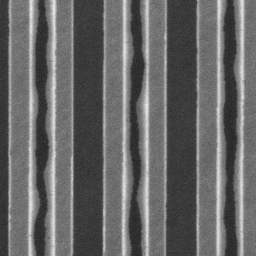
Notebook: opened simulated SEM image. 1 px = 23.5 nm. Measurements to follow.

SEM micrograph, lines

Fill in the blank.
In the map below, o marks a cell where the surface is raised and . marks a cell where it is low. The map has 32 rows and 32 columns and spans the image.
.ooo..ooo....ooo..ooo....ooo..oo
.ooo..ooo....ooo..ooo....ooo..oo
.ooo..ooo....ooo..ooo....ooo..oo
.ooo...oo....ooo..ooo....oo...oo
.ooo...oo....ooo..ooo....oo...oo
.ooo..ooo....ooo..ooo....ooo..oo
.ooo..ooo....ooo..ooo....oo...oo
.ooo..ooo....ooo..ooo....oo...oo
.ooo..ooo....ooo..ooo....oo...oo
.ooo..ooo....ooo..ooo....oo...oo
.ooo..ooo....ooo..ooo....ooo..oo
.ooo..ooo....ooo..ooo....ooo..oo
.ooo..ooo....ooo..ooo....ooo..oo
.ooo..ooo....ooo..ooo....oo...oo
.ooo..ooo....ooo..ooo....oo...oo
.ooo..ooo....ooo..ooo....oo...oo
.ooo..ooo....ooo..ooo....oo...oo
.ooo..ooo....ooo..ooo....ooo..oo
.ooo...oo....ooo..ooo....ooo..oo
.ooo..ooo....ooo..ooo....ooo..oo
.ooo..ooo....ooo..ooo....ooo..oo
.ooo..ooo....ooo..ooo....ooo..oo
.ooo..ooo....ooo..ooo....ooo..oo
.ooo..ooo....ooo..ooo....ooo..oo
.ooo..ooo....ooo..ooo....ooo..oo
.ooo..ooo....ooo..ooo....ooo..oo
.ooo..ooo....ooo..ooo....oo...oo
.ooo..ooo....ooo..ooo....oo...oo
.ooo..ooo....ooo..ooo....ooo..oo
.ooo..ooo....ooo..ooo....ooo..oo
.ooo..ooo....ooo..ooo....ooo..oo
.ooo..ooo....ooo..ooo....oo...oo